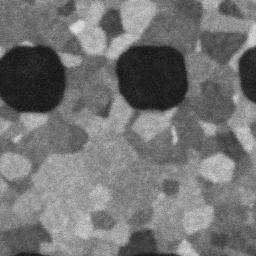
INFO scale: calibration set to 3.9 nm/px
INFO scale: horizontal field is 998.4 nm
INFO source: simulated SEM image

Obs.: holes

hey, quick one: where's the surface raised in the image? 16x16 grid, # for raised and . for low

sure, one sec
################
################
################
....####...####.
....###.....###.
....###.....###.
....####...#####
################
################
################
################
################
################
################
################
################